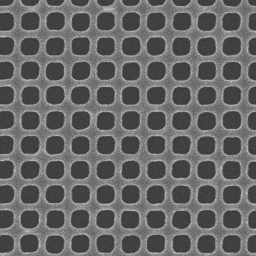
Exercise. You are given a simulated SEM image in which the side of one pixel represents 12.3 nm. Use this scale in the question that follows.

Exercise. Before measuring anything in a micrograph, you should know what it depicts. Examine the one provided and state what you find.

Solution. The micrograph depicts a regular array of holes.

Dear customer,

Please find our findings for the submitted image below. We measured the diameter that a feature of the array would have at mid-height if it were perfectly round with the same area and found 239 nm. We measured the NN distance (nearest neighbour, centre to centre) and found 300 nm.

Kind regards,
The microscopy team